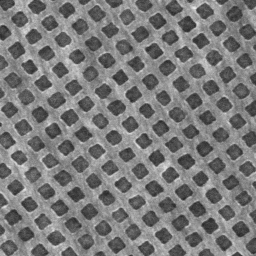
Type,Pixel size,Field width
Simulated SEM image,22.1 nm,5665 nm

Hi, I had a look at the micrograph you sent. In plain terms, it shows a regular array of holes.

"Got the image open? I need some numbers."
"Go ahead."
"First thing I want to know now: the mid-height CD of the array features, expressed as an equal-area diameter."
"350 nm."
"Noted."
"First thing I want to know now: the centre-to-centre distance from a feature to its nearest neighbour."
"0.468 microns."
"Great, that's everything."